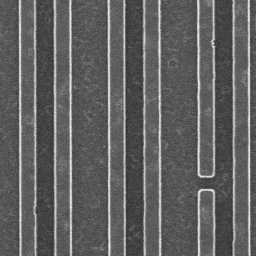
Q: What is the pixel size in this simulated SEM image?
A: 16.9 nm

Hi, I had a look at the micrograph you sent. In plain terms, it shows parallel lines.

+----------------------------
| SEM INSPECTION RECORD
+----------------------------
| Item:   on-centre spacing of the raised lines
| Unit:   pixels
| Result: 42.7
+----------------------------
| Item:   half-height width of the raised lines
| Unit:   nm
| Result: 270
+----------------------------